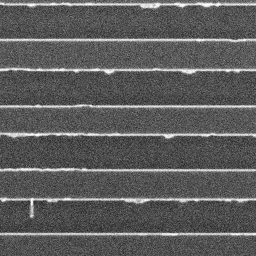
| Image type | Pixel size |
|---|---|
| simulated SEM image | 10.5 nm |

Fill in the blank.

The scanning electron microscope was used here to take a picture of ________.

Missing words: lines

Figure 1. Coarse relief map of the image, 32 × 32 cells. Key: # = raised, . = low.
################################
................................
................................
................................
................................
################################
################################
################################
################################
................................
................................
................................
................................
################################
################################
################################
################################
................................
................................
................................
................................
################################
################################
################################
################################
................................
................................
................................
................................
################################
################################
################################